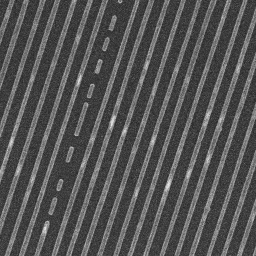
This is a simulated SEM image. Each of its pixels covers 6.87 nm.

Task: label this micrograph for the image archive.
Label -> parallel lines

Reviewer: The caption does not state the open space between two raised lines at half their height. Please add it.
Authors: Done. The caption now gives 0.0702 um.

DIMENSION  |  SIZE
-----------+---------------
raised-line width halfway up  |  27.7 nm